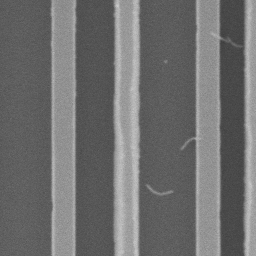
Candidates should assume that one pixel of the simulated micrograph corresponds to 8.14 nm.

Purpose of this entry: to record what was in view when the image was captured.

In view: lines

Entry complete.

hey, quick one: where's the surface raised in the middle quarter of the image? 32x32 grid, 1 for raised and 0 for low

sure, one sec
11100000000001111110000000000000
11100000000001111110000000000000
11100000000001111110000000000000
11100000000001111110000000000000
11100000000001111100000000000000
11100000000001111100000000000000
11100000000001111100000000000000
11100000000001111110000000000000
11100000000001111110000000000000
11100000000001111100000000000000
11100000000001111110000000000000
11100000000001111100000000000000
11100000000001111100000000000000
11100000000001111100000000000000
11100000000001111100000000000000
11100000000001111100000000000000
11100000000001111100000000000000
11100000000001111100000000000000
11100000000001111100000000000000
11100000000001111100000000000000
11100000000001111100000000000000
11100000000001111100000000000000
11100000000001111100000000000000
11100000000001111110000000000000
11100000000001111100000000000000
11100000000001111100000000000000
11100000000001111110000000000000
11100000000001111110000000000000
11100000000001111100000000000000
11100000000001111110000000000000
11100000000001111100000000000000
11100000000001111100000000000000